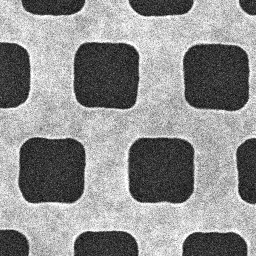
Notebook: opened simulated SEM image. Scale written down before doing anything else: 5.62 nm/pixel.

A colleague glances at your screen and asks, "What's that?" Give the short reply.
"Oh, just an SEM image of holes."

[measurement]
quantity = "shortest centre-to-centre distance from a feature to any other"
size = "0.611 um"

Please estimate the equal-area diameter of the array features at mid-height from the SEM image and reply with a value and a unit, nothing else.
404 nm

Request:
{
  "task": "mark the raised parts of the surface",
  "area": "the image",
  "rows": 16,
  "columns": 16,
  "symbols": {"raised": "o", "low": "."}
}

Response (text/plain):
oo...ooo....ooo.
oooooooooooooooo
oooooooooooooooo
..ooo....ooo...o
..ooo....oo.....
..ooo....oo.....
.oooo...oooo...o
oooooooooooooooo
oooooooooooooooo
o....ooo....ooo.
o....ooo....ooo.
o....ooo....ooo.
oo...oooo...ooo.
oooooooooooooooo
.oooo...oooooooo
..ooo....oo....o